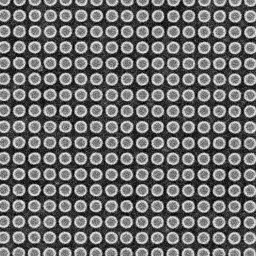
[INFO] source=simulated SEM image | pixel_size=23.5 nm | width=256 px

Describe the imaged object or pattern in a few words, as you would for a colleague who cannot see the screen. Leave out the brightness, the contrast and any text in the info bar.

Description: a regular array of raised bodies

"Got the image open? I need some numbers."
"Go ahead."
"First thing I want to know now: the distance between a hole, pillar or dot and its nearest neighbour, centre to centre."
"360 nanometers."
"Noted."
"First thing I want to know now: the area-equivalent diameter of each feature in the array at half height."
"272 nm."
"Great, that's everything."